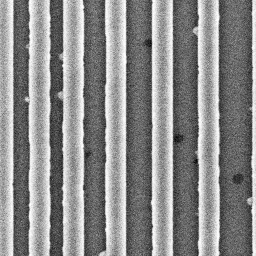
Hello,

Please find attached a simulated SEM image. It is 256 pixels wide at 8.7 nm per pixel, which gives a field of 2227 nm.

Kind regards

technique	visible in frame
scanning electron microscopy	lines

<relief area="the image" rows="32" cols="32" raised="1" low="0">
11001100110001110001100001100000
11001100110001110001100001100000
11001100110001110001100001100000
11001100110001110001100001100000
11001100110001110001100001100000
11001100110001110001100001100000
11001100110001110001100001100000
11001100110001110001100001100000
11001100110001110001100001100000
11001100110001110001100001100000
11001100110001110001100001100000
11001100110001110001100001100000
11001100110001110001100001100000
11001100110001110001100001100000
11001100110001110001100001100000
11001100110001110001100001100000
11001100110001110001100001100000
11001100110001110001100001100000
11001100110001110001100001100000
11001100110001110001100001100000
11001100110001110001100001100000
11001100110001110001100001100000
11001100110001110001100001100000
11001100110001110001100001100000
11001100110001110001100001100000
11001100110001110001100001100000
11001100110001110001100001100000
11001100110001110001100001100000
11001100110001110001100001100000
11001100110001110001100001100000
11001100110001110001100001100000
11001100110001110001100001100000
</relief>